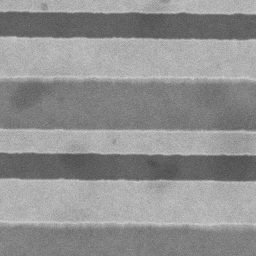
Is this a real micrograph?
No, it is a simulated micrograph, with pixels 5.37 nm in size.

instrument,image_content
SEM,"lines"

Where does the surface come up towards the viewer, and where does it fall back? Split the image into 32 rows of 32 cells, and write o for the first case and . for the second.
oooooooooooooooooooooooooooooooo
........oooooooo.ooooooooooooooo
................................
................................
................................
oooooooooooooooooooooooooooooooo
oooooooooooooooooooooooooooooooo
oooooooooooooooooooooooooooooooo
oooooooooooooooooooooooooooooooo
oooooooooooooooooooooooooooooooo
................................
................................
................................
................................
................................
................................
oooooooooooooooooooooooooooooooo
oooooooooooooooooooooooooooooooo
oooooooooooooooooooooooooooooooo
................................
................................
................................
ooo.o..o........................
oooooooooooooooooooooooooooooooo
oooooooooooooooooooooooooooooooo
oooooooooooooooooooooooooooooooo
oooooooooooooooooooooooooooooooo
oooooooooooooooooooooooooooooooo
................................
................................
................................
................................